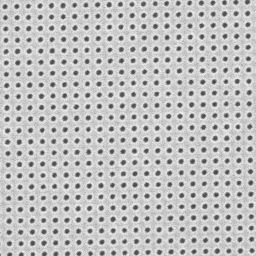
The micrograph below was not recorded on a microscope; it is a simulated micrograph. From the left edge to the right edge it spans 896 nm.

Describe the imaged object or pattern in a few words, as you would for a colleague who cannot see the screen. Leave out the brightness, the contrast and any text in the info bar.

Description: a regular array of holes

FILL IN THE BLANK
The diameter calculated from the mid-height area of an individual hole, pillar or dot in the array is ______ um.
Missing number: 0.0189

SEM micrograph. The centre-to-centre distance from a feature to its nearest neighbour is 38.8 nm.